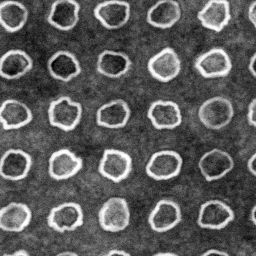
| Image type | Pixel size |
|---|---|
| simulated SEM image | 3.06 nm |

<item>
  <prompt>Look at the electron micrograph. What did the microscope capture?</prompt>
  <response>a regular array of raised bodies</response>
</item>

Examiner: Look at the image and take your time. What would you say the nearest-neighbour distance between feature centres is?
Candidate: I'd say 151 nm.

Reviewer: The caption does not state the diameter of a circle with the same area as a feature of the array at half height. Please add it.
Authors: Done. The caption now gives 92 nanometers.